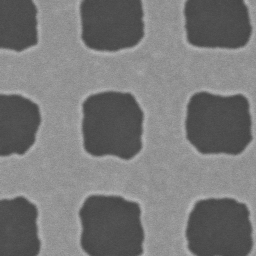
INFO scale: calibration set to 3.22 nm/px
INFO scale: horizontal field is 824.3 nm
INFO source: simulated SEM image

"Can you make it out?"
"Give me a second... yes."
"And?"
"holes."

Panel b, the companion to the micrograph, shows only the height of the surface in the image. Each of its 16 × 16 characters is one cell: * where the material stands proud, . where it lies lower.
..***....***...*
..***....***....
..***....***....
****************
****************
****************
..***....***....
...**....***....
..***....***....
..***....***...*
****************
****************
..***...*****..*
..***....***....
..***....***....
...**....***....